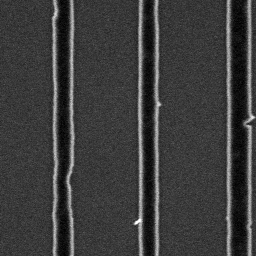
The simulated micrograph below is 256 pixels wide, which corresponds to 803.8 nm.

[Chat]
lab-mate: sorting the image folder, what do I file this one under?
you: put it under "one or a few lines or trenches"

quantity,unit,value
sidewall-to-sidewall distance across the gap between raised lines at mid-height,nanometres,218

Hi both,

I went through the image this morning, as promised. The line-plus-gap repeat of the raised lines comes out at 276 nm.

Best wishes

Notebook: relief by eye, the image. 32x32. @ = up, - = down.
-------@@---------@@---------@@-
-------@@---------@@---------@@-
-------@@---------@@---------@@-
-------@@--------@@@--------@@@-
-------@@---------@@---------@@-
-------@@--------@@@---------@@-
-------@@--------@@@---------@@-
-------@@---------@@---------@@-
-------@@--------@@@---------@@-
-------@@---------@@---------@@-
-------@@--------@@@---------@@-
-------@@--------@@@---------@@-
-------@@--------@@@---------@@-
-------@@--------@@@---------@@-
-------@@--------@@@---------@@-
-------@@--------@@@---------@@-
-------@@--------@@@---------@@-
-------@@--------@@@---------@@-
-------@@---------@@---------@@-
-------@@---------@@---------@@-
-------@@---------@@---------@@-
-------@@---------@@---------@@-
-------@@---------@@---------@@-
-------@@---------@@---------@@-
-------@@---------@@---------@@-
-------@@---------@@---------@@-
-------@@---------@@---------@@-
-------@@--------@@@--------@@@-
-------@@--------@@@---------@@-
-------@@---------@@---------@@-
-------@@---------@@---------@@-
-------@@---------@@---------@@-